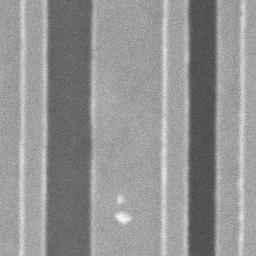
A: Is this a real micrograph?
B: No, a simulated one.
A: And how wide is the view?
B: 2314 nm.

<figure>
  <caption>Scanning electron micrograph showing lines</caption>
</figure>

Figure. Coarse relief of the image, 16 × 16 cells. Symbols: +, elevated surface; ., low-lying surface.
+++...++++++..++
+++...++++++..++
+++...++++++..++
+++...++++++..++
+++...++++++..++
+++...++++++..++
+++...++++++..++
+++...++++++..++
+++...++++++..++
+++...++++++..++
+++...++++++..++
+++...++++++..++
+++...++++++..++
+++...++++++..++
+++...++++++..++
+++...++++++..++